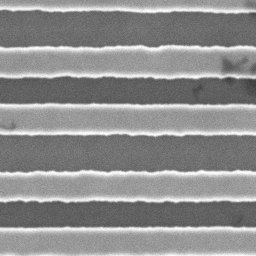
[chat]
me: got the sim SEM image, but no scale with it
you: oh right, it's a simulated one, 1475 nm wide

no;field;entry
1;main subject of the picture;lines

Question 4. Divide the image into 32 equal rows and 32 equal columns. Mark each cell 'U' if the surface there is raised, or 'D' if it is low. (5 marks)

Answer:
UUUUUUUUUUUUUUUUUUUUUUUUUUUUUUUU
DDDDDDDDDDDDDDDDDDDDDDDDDDDDUUDD
DDDDDDDDDDDDDDDDDDDDDDDDDDDDDDDD
DDDDDDDDDDDDDDDDDDDDDDDDDDDDDDDD
DDDDDDDDDDDDDDDDDDDDDDDDDDDDDDDD
DDDDDDDDDDDDDDDDDDDDDDDDDDDDDDDD
UUUUUUUUUUUUUUUUUUUUUUUUUUUUUUUU
UUUUUUUUUUUUUUUUUUUUUUUUUUUUUUUU
UUUUUUUUUUUUUUUUUUUUUUUUUUUUUUUU
UUUUUUUUDUUUUUUUUUUUUUUUUUUUUUUU
DDDDDDDDDDDDDDDDDDDDDDDDDDDDDDDD
DDDDDDDDDDDDDDDDDDDDDDDDDDDDDDDD
DDDDDDDDDDDDDDDDDDDDDDDDDDDDDDDD
UUUUUUUUUUUUUUUUUUUUUUUUUUUUUUUU
UUUUUUUUUUUUUUUUUUUUUUUUUUUUUUUU
UUUUUUUUUUUUUUUUUUUUUUUUUUUUUUUU
UUUUUUUUUUUUUUUUUUUUUUUUUUUUUUUU
DDDDDDDDDDDDDDDDDDDDDDDDDDDDDDDD
DDDDDDDDDDDDDDDDDDDDDDDDDDDDDDDD
DDDDDDDDDDDDDDDDDDDDDDDDDDDDDDDD
DDDDDDDDDDDDDDDDDDDDDDDDDDDDDDDD
DDDDUDUDDDUUDDUDUDDDUUDDDUDDDUUU
UUUUUUUUUUUUUUUUUUUUUUUUUUUUUUUU
UUUUUUUUUUUUUUUUUUUUUUUUUUUUUUUU
UUUUUUUUUUUUUUUUUUUUUUUUUUUUUUUU
DDDDDDDDDDDDDDDDDDDDDDDDDDDDDDDD
DDDDDDDDDDDDDDDDDDDDDDDDDDDDDDDD
DDDDDDDDDDDDDDDDDDDDDDDDDDDDDDDD
DDDDDDDDUDUDUDUDUUUUUUUUUUUUUUUD
UUUUUUUUUUUUUUUUUUUUUUUUUUUUUUUU
UUUUUUUUUUUUUUUUUUUUUUUUUUUUUUUU
UUUUUUUUUUUUUUUUUUUUUUUUUUUUUUUU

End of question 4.